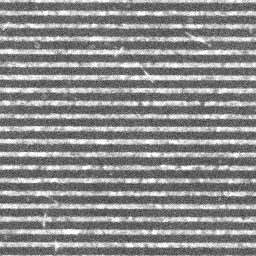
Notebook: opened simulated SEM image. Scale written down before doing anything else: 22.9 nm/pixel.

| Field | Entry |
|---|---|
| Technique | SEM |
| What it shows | parallel lines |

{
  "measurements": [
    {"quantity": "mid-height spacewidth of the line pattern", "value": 215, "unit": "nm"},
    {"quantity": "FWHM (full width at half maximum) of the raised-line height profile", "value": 0.0803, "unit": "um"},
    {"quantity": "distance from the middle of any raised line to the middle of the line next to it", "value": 0.295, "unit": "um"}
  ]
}